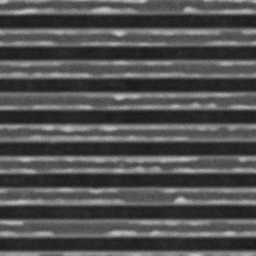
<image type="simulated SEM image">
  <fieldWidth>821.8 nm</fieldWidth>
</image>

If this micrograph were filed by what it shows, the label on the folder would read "parallel lines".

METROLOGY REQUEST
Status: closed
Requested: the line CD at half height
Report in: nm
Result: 54.1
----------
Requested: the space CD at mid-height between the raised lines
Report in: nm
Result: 48.5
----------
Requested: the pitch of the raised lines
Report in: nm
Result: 102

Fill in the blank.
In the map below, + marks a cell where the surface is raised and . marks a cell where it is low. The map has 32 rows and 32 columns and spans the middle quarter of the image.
++++++++++++++++++++++++++++++++
++++++++++++++++++++++++++++++++
++++++++++++++++++++++++++++++++
................................
................................
................................
................................
++++++++++++++++++++++++++++++++
++++++++++++++++++++++++++++++++
++++++++++++++++++++++++++++++++
++++++++++++++++++++++++++++++++
................................
................................
................................
................................
++++++++++++++++++++++++++++++++
++++++++++++++++++++++++++++++++
++++++++++++++++++++++++++++++++
++++++++++++++++++++++++++++++++
................................
................................
................................
................................
++++++++++++++++++++++++++++++++
++++++++++++++++++++++++++++++++
++++++++++++++++++++++++++++++++
++++++++++++++++++++++++++++++++
................................
................................
................................
................................
++++++++++++++++++++++++++++++++